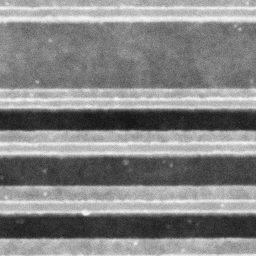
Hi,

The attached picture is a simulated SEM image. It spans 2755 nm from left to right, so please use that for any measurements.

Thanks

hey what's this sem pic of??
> lines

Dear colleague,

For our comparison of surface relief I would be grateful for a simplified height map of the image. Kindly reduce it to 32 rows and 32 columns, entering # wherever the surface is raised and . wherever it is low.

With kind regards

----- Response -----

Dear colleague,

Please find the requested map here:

################################
################################
................................
................................
................................
................................
................................
................................
................................
................................
................................
################################
################################
##...###.#.#######.....##.#####.
................................
................................
####################.###########
################################
################################
................................
................................
................................
................................
################################
################################
################################
################################
................................
................................
................................
################################
################################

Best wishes